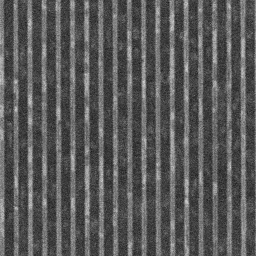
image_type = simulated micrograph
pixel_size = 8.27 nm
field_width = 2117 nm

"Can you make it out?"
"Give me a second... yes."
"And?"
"parallel lines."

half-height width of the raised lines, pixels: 2.74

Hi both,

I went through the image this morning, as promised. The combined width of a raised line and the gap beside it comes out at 118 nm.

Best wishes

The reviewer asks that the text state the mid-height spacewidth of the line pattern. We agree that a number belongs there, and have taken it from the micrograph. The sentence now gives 92 nanometers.